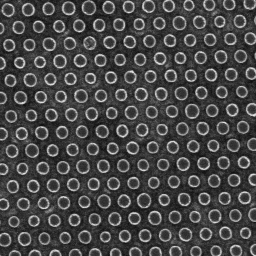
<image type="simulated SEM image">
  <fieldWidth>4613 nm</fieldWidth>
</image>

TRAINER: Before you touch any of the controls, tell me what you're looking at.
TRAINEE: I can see a regular array of raised bodies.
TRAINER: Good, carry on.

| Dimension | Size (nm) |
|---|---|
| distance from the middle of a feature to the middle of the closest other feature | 357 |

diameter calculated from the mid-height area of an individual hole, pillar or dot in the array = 216 nanometres